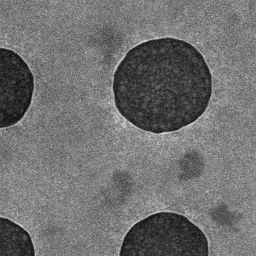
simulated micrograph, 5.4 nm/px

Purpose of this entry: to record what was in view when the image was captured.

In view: holes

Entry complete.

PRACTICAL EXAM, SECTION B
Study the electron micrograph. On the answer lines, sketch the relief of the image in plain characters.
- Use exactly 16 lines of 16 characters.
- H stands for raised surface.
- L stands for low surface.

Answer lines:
HHHHHHHHHHHHHHHH
HHHHHHHHHHHHHHHH
HHHHHHHHHHLHHHHH
LHHHHHHHLLLLLHHH
LLHHHHHLLLLLLHHH
LLHHHHHLLLLLLHHH
LLHHHHHLLLLLLHHH
LHHHHHHHLLLLHHHH
HHHHHHHHHHHHHHHH
HHHHHHHHHHHHHHHH
HHHHHHHHHHHHHHHH
HHHHHHHHHHHHHHHH
HHHHHHHHHHHHHHHH
HHHHHHHHHLLHHHHH
LLHHHHHHLLLLLHHH
LLHHHHHHLLLLLHHH